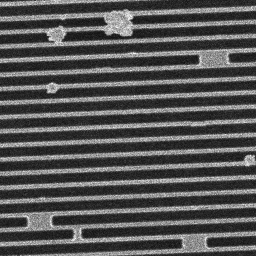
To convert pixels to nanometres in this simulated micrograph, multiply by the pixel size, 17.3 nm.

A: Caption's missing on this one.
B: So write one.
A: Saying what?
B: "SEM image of parallel lines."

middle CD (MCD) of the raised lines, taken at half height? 0.0884 µm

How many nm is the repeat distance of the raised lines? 243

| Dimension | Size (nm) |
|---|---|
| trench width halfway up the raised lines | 149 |